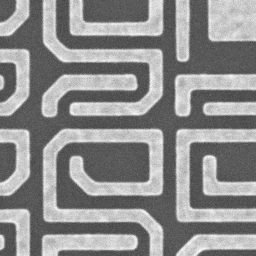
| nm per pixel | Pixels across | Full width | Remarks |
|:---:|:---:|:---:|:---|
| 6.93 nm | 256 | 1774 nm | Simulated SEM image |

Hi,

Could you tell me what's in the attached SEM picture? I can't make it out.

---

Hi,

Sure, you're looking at wiring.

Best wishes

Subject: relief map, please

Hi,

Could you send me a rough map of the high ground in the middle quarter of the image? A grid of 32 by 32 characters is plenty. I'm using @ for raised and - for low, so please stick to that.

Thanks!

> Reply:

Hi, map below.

----------------------@@--------
----------------------@@--------
----------------------@@--------
@@@@@@@@@@@@@@@@@@----@@----@@@@
@@@@@@@@@@@@@@@@@@----@@----@@@@
@@@@@@@@@@@@@@@@@@----@@----@@@@
@--------------------@@@----@@@@
---------------------@@@----@@@-
--------------------@@@@----@@@-
-------------------@@@@-----@@@-
--@@@@@@@@@@@@@@@@@@@@------@@@-
--@@@@@@@@@@@@@@@@@@@-------@@@-
--@@@@@@@@@@@@@@@@@---------@@@-
--------------------------------
--------------------------------
--------------------------------
@@@@@@@@@@@@@@@@@@@@@@@@-----@@@
@@@@@@@@@@@@@@@@@@@@@@@@----@@@@
@@@@@@@@@@@@@@@@@@@@@@@@@---@@@@
@--------------------@@@@---@@@@
---------------------@@@@---@@@-
----------------------@@@---@@@-
----------------------@@@---@@@-
--@@------------------@@@---@@@-
--@@@-----------------@@@---@@@-
--@@@-----------------@@@---@@@-
--@@@-----------------@@@---@@@-
--@@@-----------------@@@---@@@-
--@@@@----------------@@@---@@@-
---@@@@@-------------@@@@---@@@-
----@@@@@@@@@@@@@@@@@@@@@---@@@-
-----@@@@@@@@@@@@@@@@@@@----@@@-